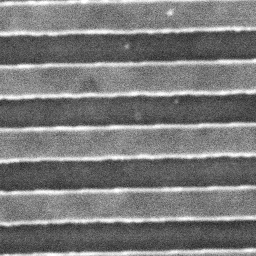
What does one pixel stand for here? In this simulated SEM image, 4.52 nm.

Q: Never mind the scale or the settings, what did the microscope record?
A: lines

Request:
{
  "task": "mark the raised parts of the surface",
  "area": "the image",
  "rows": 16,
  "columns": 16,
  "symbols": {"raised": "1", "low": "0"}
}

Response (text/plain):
1111111111111111
1111111111111111
0000000000000000
0000000000000000
1111111111111111
1111111111111111
0000000000000000
0000000000000000
1111111111111111
1111111111111111
0000000000000000
0000000000000000
1111111111111111
1111111111111111
0000000000000000
0000000000000000